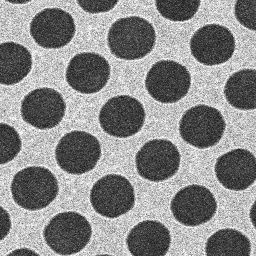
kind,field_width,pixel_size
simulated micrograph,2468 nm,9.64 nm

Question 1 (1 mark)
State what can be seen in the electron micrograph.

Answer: a regular array of holes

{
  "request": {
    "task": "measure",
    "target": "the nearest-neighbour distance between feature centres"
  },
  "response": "537 nanometres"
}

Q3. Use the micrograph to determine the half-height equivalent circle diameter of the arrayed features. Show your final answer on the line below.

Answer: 44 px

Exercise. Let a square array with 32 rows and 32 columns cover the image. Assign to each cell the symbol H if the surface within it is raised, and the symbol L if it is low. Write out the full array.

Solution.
HHHHHHHHHHLLLLHHHHHLLLLLLHHHHLLL
HHHHHLLLHHHLLHHHHHHHLLLLLHHHHLLL
HHHHLLLLLHHHHHHLLLHHHLLHHHHHHHLL
HHHHLLLLLHHHHHLLLLLHHHHHHLLLHHHL
HHHHLLLLLHHHHLLLLLLHHHHHLLLLLHHH
LLHHHLLLHHHHHHLLLLLHHHHHLLLLLHHH
LLLLHHHHHHHHHHLLLLLHHHHHLLLLLHHH
LLLLHHHHHLLLLHHHHHHHHHHHHLLLHHHH
LLLLHHHHLLLLLLHHHHHLLLLHHHHHHHHH
LLLHHHHHLLLLLLHHHHLLLLLLHHHHHLLL
LLHHHHHHHLLLLHHHHHLLLLLLHHHHLLLL
HHHHLLLHHHLLHHHHHHHLLLLHHHHHLLLL
HHHLLLLLHHHHHHLLLHHHLLHHHHHHLLLL
HHHLLLLLHHHHHLLLLLHHHHHHLLLHHHLL
HHHLLLLLHHHHLLLLLLHHHHHLLLLLHHHH
LHHHLLLHHHHHHLLLLLHHHHLLLLLLHHHH
LLHHHHHHHLLHHLLLLHHHHHLLLLLLHHHH
LLLHHHHHLLLLHHHHHHHLLHHLLLLHHHHH
LLLHHHHLLLLLLHHHHHLLLLHHHLHHHHHH
LLHHHHHLLLLLHHHHHLLLLLHHHHHHLLLL
HHHHHHHLLLLLHHHHHLLLLLHHHHHLLLLL
HHLLLLHHLLLHHHHHHLLLLLHHHHHLLLLL
HHLLLLLHHHHHLLLLHHHLHHHHHHHLLLLL
HLLLLLLHHHHLLLLLLHHHHHHLLLHHLLLH
HHLLLLLHHHHLLLLLLHHHHHLLLLLHHHHH
HHLLLLHHHHHLLLLLLHHHHLLLLLLHHHHH
LHHHHHHHLHHHLLLLHHHHHLLLLLLHHHHL
LHHHHHLLLLLHHHHHHHHHHHLLLLHHHHHL
LHHHHHLLLLLHHHHHHLLLLHHHHHHHHHHH
LHHHHLLLLLLHHHHHLLLLLHHHHHLLLLLH
HHHHHHLLLLLHHHHHLLLLLHHHHHLLLLLH
HLLLHHHLLLHHHHHHLLLLLHHHHHLLLLLH